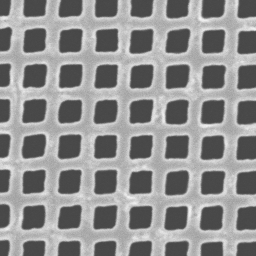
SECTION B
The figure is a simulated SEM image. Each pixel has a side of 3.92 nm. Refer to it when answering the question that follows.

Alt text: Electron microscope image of a regular array of holes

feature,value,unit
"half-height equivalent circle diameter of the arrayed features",99.1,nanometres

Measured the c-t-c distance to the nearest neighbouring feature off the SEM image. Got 137 nm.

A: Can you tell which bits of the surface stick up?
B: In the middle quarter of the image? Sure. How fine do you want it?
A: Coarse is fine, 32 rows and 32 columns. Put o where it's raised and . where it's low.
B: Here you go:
.....oooo....oooo.....oooo.....o
.....ooo......ooo.....ooo.......
.....ooo.....oooo.....ooo......o
....oooo.....ooo......ooo......o
....oooo.....ooo......ooo......o
....oooo.....ooo......ooo......o
oooooooooooooooooooooooooooooooo
oooooooooooooooooooooooooooooooo
oooooooooooooooooooooooooooooooo
....oooo.....oooo.....oooo.....o
.....ooo......ooo.....oooo.....o
.....ooo.....ooo......ooo......o
....oooo.....ooo......ooo......o
....oooo.....ooo......ooo......o
...ooooo.....ooo.....oooo.....oo
oooooooooooooooooooooooooooooooo
oooooooooooooooooooooooooooooooo
oo..oooooooooooooooooooooooooooo
....oooo.....oooo.....oooo.....o
....oooo.....oooo.....oooo.....o
....ooo......oooo.....oooo.....o
....ooo......oooo.....oooo.....o
....ooo......ooo......ooo......o
...ooooo....ooooo....oooo.....oo
oooooooooooooooooooooooooooooooo
oooooooooooooooooooooooooooooooo
....ooooo.oo.ooooooooooooooooooo
....oooo.....oooo.....oooo.....o
....oooo.....ooo......oooo.....o
....oooo.....ooo......oooo.....o
....oooo.....ooo......ooo......o
....ooo......ooo......ooo......o